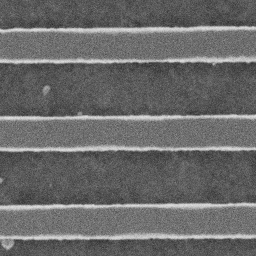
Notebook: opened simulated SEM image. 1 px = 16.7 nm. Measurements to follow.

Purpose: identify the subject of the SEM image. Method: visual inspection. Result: lines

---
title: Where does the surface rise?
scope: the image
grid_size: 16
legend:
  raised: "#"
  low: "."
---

................
................
################
################
................
................
................
################
################
................
................
................
................
################
################
................